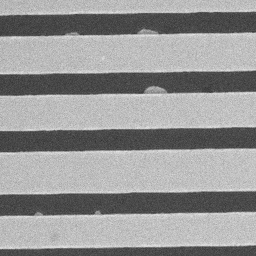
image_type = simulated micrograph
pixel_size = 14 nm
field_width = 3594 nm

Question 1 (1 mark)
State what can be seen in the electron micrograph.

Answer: lines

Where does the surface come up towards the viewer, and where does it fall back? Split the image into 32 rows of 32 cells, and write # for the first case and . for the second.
################################
#########################.#.....
................................
................................
......##########################
################################
################################
################################
################################
................................
................................
................................
################################
################################
################################
################################
................................
................................
................................
################################
################################
################################
################################
################################
................................
................................
................................
################################
################################
################################
################################
................................